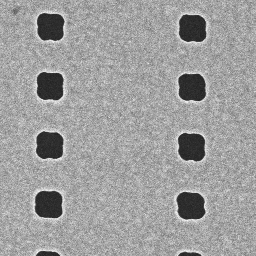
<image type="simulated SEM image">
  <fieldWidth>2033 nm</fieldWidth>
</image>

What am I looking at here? a regular array of holes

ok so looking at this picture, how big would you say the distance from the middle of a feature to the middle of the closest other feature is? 0.468 micrometres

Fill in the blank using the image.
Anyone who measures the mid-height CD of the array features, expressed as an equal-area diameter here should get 231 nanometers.